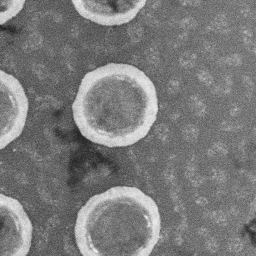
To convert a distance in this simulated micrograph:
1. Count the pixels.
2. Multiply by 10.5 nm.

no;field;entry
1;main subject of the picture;raised bodies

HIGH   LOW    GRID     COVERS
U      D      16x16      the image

UDDDDUUUUDDDDDDD
DDDDDDDDDDDDDDDD
DDDDDDDDDDDDDDDD
DDDDDDDDDDDDDDDD
DDDDDDUUDDDDDDDD
UDDDDUUUUDDDDDDD
UDDDDUUUUUDDDDDD
UDDDDUUUUDDDDDDD
UDDDDDUUDDDDDDDD
DDDDDDDDDDDDDDDD
DDDDDDDDDDDDDDDD
DDDDDDDDDDDDDDDD
DDDDDDUUUDDDDDDD
UDDDDUUUUUDDDDDD
UUDDDUUUUUDDDDDD
UUDDDUUUUDDDDDDD